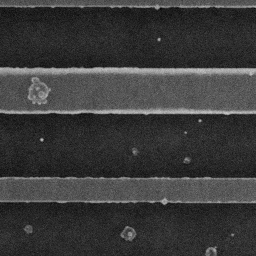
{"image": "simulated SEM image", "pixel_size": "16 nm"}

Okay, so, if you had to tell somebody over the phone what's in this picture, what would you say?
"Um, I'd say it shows lines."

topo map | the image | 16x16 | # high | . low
................
................
................
................
################
################
################
................
................
................
................
################
################
................
................
................